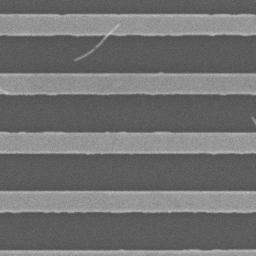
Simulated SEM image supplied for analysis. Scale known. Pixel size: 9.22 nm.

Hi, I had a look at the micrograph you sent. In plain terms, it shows lines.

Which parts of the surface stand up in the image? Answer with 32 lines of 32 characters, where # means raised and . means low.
................................
................................
################################
################################
................................
................................
................................
................................
................................
################################
################################
################################
................................
................................
................................
................................
................................
################################
################################
................................
................................
................................
................................
................................
################################
################################
###..######...##..##.#....######
................................
................................
................................
................................
################################